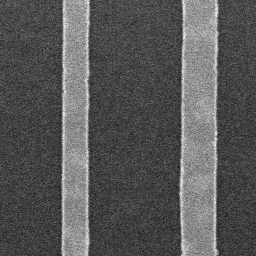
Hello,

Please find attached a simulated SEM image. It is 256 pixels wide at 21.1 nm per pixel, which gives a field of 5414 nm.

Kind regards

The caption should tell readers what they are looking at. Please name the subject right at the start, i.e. one or a few lines or trenches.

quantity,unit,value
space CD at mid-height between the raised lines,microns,2.01